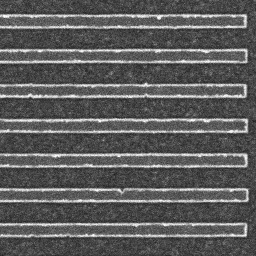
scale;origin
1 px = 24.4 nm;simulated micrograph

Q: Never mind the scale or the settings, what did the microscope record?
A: parallel lines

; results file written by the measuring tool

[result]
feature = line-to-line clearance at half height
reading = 556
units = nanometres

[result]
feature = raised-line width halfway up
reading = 290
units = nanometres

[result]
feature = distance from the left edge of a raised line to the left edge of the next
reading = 850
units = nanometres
